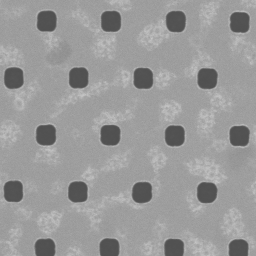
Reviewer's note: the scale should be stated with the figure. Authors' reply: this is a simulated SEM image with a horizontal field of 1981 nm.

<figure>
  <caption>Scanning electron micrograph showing a regular array of holes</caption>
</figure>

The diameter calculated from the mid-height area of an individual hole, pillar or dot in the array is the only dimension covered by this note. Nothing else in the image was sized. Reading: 164 nanometres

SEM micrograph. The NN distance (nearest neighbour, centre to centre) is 64.4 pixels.